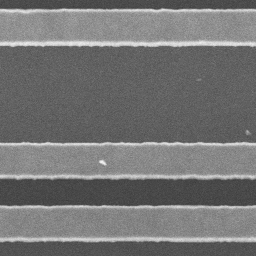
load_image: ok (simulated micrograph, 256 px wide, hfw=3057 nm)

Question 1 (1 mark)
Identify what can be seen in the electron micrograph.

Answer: lines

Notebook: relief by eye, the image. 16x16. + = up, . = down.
................
++++++++++++++++
++++++++++++++++
................
................
................
................
................
................
++++++++++++++++
++++++++++++++++
................
................
++++++++++++++++
++++++++++++++++
................